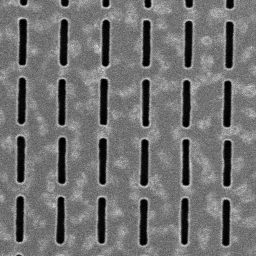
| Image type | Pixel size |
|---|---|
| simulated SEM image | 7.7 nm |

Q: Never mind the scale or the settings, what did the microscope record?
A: a regular array of holes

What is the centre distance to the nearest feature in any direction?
0.315 microns